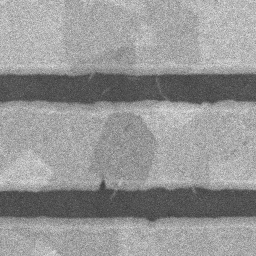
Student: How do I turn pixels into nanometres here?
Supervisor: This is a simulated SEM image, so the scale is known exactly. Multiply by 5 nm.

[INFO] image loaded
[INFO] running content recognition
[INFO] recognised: one or a few lines or trenches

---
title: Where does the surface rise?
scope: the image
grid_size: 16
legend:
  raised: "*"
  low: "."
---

****************
****************
****************
****************
................
................
................
****************
****************
****************
****************
******.*****..**
................
................
****************
****************